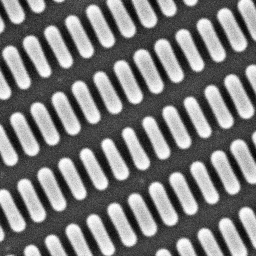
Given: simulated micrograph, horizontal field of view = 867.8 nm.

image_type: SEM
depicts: groups of lines, slits or small figures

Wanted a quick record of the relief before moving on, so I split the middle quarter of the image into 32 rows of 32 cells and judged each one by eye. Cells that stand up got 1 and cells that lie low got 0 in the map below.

10000000000001110011111001111000
00000000000001111001111000111000
00000000110001111001111000111100
00000000111000111000111100011100
00000000111000111100011100000000
00111000111100011100011100000000
00111100011100011110001100000000
00011100011110001110000000000000
00011110001111001110000000000001
10001110001111000110000000000011
10001111000111000000000000000011
11000111000111000000000001110001
11000111100000000000000001110001
11100011100000000000010001111000
11100001000000000000111000111000
11110000000000000000111000111100
01110000000000011000011100011100
00000000000000011100011100011110
00000000000000011100011110001110
00000000001100001110001110001111
00000000001100001110001111000110
00000100001110001111000111000000
00001110001111000111000111000000
00001111000111000111100010000000
11000111000111100011100000000000
11000111100011100011100000000000
11100011100011110000000000000000
11100011110001110000000000000000
11110001110001100000000000011100
01110001111000000000000000011100
01111000110000000000001100011110
00111000000000000000011110001110